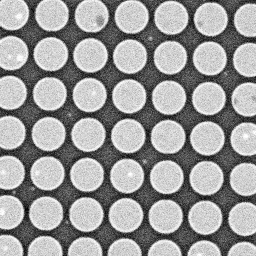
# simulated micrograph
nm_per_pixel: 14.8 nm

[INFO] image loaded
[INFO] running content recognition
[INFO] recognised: an array of small figures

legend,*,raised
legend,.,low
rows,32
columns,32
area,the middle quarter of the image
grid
...*******...*******...*******..
.....***......*****.....*****...
................................
................................
....*****.....****.......**.....
...*******...******....******...
..********...*******...*******..
..********..********..********..
..********..********..********..
...*******...*******..********..
...******....*******...*******..
.....***......*****.....*****...
................................
................................
....*****.....****......****....
...*******...******....******...
..********..********..********..
..********..********..********..
..********..********..********..
..********..********..********..
...******....******....******...
.....***......****.....******...
................................
................................
...*****......****.......**.....
..*******....******....******...
..********..********..*******...
..********..********..********..
..********..********..********..
..*******...********..*******...
...******...*******...*******...
....***.......****.....*****....